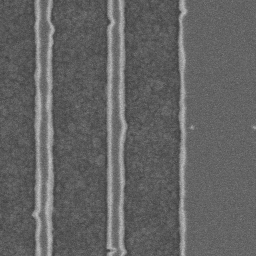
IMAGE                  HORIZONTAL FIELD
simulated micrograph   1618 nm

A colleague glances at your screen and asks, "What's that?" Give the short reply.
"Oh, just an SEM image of one or a few lines or trenches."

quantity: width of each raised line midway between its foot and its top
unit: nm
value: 91.6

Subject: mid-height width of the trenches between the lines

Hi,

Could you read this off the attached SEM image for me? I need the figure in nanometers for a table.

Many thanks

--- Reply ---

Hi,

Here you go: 366